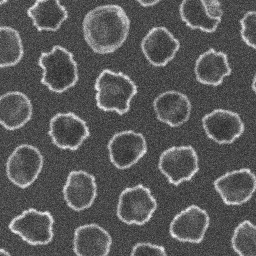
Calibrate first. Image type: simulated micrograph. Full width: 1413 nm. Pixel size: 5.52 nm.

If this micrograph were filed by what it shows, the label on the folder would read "a regular array of raised bodies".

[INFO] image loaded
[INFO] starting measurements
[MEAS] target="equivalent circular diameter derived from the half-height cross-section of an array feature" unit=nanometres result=199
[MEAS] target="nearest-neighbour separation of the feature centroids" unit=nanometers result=312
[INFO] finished